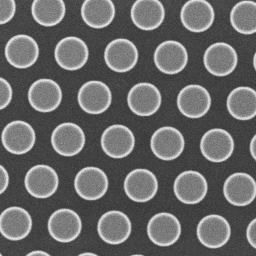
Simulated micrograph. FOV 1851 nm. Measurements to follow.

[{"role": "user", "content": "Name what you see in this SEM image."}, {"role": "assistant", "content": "an array of small figures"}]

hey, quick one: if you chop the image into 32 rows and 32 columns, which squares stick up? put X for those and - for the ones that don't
XX--XXXX--XXXX---XXX---XXX----XX
XX--XXXX--XXXX--XXXXX--XXXX--XXX
X---XXXX--XXXX---XXX---XXXX--XXX
------------X----XX----XXX---XXX
--X-----------------------------
-XXXX--XXXX---XXX---XXX----X----
-XXXX--XXXX--XXXX--XXXX---XXX---
-XXX---XXXX--XXXX--XXXX---XXXX--
--------XX----XX----XXX---XXX---
--------------------------------
X---XXX----XX----XX-------------
X---XXXX--XXXX--XXXX---XXX---XXX
X---XXXX--XXXX--XXXX--XXXX--XXXX
----XXX---XXX---XXXX--XXXX--XXXX
-----------------------XX----XXX
-XX-----X-----------------------
XXXX---XXX---XXX---XXX----XX----
XXXX--XXXXX--XXXX--XXXX--XXXX--X
-XXX---XXX---XXXX--XXXX--XXXX--X
--------X-----XX----XX----XXX---
--------------------------------
X--XXXX---XXX---XXX----XX-------
X--XXXX--XXXX---XXXX--XXXX--XXXX
X--XXXX--XXXX---XXXX--XXXX--XXXX
----XX----XXX---XXX---XXXX--XXXX
-----------------------------XX-
XXX----XX----XX-----------------
XXXX--XXXX--XXXX---XXX---XXX----
XXXX--XXXX--XXXX--XXXXX--XXXX--X
XXX---XXXX---XXX---XXX---XXXX--X
--------------X-----X----XXX---X
----XX--------------------------